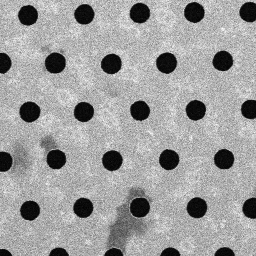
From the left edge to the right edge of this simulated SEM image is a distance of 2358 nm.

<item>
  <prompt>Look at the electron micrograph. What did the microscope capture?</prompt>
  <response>a regular array of holes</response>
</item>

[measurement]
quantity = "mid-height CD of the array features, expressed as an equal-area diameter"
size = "188 nm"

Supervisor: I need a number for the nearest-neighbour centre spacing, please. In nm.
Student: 502